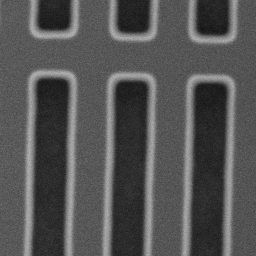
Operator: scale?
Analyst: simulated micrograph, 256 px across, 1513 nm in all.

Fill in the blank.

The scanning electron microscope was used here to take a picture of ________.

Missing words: groups of lines, slits or small figures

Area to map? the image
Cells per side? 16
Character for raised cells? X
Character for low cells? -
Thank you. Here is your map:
XX---XX---XX---X
XX---XX--XXX---X
XXXXXXXXXXXXXXXX
XXXXXXXXXXXXXXXX
XXXXXXXXXXXXXXXX
XX---XX--XXX--XX
XX--XXX--XXX--XX
XX--XXX--XXX--XX
XX--XXX--XXX--XX
XX--XXX--XXX--XX
XX--XXX--XXX--XX
XX--XXX--XXX--XX
XX--XXX--XXX--XX
XX--XXX--XXX--XX
XX--XXX--XXX--XX
XX--XXX--XXX--XX